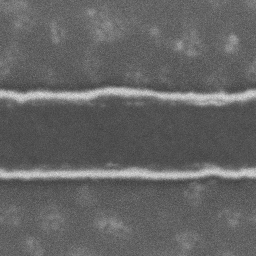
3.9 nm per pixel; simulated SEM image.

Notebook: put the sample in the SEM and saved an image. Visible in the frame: one or a few lines or trenches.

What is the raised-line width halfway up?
310 nanometres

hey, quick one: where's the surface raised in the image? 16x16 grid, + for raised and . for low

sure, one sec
................
................
................
................
................
................
++++++++++++++++
++++++++++++++++
++++++++++++++++
++++++++++++++++
++++++++++++++++
................
................
................
................
................